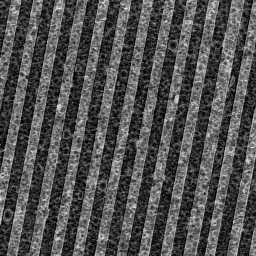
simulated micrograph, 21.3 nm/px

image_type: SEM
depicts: parallel lines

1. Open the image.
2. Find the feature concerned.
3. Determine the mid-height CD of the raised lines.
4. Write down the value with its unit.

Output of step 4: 204 nm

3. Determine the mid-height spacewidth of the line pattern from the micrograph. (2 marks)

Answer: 256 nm